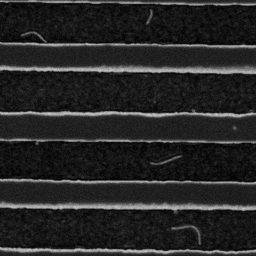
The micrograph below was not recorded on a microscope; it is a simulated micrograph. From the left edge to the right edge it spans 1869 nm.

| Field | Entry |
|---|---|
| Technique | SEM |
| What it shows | lines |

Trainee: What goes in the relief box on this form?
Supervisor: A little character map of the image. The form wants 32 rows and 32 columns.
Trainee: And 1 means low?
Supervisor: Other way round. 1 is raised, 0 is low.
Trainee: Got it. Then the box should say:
00000000000000000000111111111111
00000000000000000000000000000000
00000000000000000000000000000000
00000000000000000000000000000000
00000000000000000000000000000000
11111000001000000000000000000000
11111111111111111111111111111111
11111111111111111111111111111111
11111111111111111111111111111111
00000000000000000000000000000000
00000000000000000000000000000000
00000000000000000000000000000000
00000000000000000000000000000000
00000000000000000000000000000000
11111111111111111111111111111111
11111111111111111111111111111111
11111111111111111111111111111111
11111111111111111111111111111111
00000000000000000000000000000000
00000000000000000000000000000000
00000000000000000000000000000000
00000000000000000000000000000000
11110000000000000000000000000000
11111111111111111111111111111111
11111111111111111111111111111111
11111111111111111111111111111111
00000000000000000000000000000000
00000000000000000000000000000000
00000000000000000000000000000000
00000000000000000000000000000000
00000000000000000000000000000000
11111111111111111111111111111111